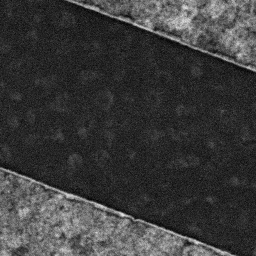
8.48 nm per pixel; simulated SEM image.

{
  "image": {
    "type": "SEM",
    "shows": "one or a few lines or trenches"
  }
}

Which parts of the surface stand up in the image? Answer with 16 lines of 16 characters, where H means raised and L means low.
LLLLLLHHHHHHHHHH
LLLLLLLLHHHHHHHH
LLLLLLLLLLLHHHHH
LLLLLLLLLLLLLLHH
LLLLLLLLLLLLLLLL
LLLLLLLLLLLLLLLL
LLLLLLLLLLLLLLLL
LLLLLLLLLLLLLLLL
LLLLLLLLLLLLLLLL
LLLLLLLLLLLLLLLL
LLLLLLLLLLLLLLLL
HHHLLLLLLLLLLLLL
HHHHHLLLLLLLLLLL
HHHHHHHHLLLLLLLL
HHHHHHHHHHHLLLLL
HHHHHHHHHHHHHLLL